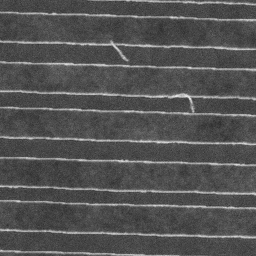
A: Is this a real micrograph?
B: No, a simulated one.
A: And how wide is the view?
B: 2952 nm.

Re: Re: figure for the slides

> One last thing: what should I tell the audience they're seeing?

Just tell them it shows lines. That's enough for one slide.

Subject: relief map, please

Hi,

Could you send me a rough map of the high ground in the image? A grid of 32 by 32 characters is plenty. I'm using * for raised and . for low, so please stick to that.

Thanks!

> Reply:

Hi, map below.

..............................**
................................
********************************
********************************
********************************
..........**********************
................................
................................
************************........
********************************
********************************
..******************************
................................
***.............................
********************************
********************************
********************************
...........*********************
................................
................................
***************************.....
********************************
********************************
......**************************
................................
************....................
********************************
********************************
********************************
.........................*******
................................
***.............................